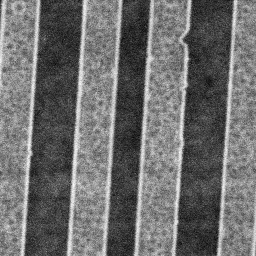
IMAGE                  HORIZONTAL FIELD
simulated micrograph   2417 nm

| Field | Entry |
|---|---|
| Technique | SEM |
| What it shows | one or a few lines or trenches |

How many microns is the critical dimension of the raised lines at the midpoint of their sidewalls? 0.335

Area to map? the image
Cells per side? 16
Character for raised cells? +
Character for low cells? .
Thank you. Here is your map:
++...+++..++...+
++...++..+++...+
++...++..++....+
++...++..+++...+
++...++..+++..++
++...++..+++..++
++...++..++...++
++...++..++...++
++...++..++...++
++...++..++...++
++...++..++...++
++...++..++...++
++...++..++...++
++..+++..++...++
+...+++..++...++
+...+++..++...++